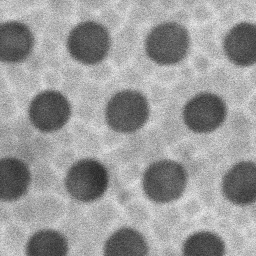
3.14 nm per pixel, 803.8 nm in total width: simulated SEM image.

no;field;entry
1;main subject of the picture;holes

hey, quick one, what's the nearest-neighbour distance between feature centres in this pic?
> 0.243 µm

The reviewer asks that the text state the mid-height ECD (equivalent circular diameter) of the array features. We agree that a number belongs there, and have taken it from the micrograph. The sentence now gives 44.6 px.